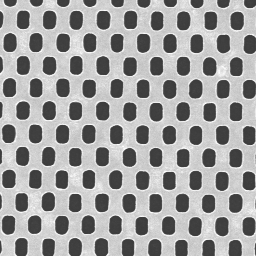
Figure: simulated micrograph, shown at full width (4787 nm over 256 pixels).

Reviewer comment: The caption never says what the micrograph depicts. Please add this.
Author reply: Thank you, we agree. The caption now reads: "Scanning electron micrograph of a regular array of holes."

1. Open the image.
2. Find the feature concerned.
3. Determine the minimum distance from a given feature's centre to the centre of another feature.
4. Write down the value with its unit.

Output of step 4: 487 nanometres